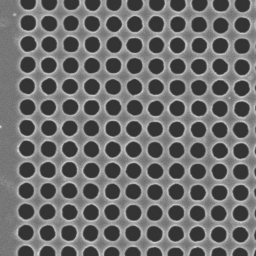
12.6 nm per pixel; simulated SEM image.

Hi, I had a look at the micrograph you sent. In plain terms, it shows a regular array of holes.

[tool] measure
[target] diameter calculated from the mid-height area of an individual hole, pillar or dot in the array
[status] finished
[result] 196 nm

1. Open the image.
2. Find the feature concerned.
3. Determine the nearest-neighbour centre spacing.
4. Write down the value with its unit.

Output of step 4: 261 nanometres